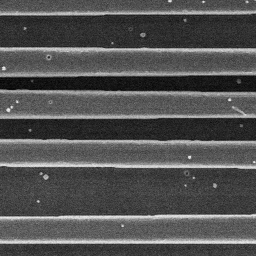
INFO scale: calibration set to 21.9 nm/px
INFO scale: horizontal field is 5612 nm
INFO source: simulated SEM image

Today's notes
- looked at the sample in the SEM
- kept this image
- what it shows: lines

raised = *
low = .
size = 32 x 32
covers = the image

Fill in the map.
********************************
********************************
................................
................................
................................
................................
********************************
********************************
********************************
******..........................
................................
************************........
********************************
********************************
********************************
................................
................................
****............................
********************************
********************************
********************************
................................
................................
................................
................................
................................
................................
********************************
********************************
********************************
................................
................................